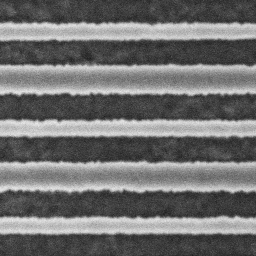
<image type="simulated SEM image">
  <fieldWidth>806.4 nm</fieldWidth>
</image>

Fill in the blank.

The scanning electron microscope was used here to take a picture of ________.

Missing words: lines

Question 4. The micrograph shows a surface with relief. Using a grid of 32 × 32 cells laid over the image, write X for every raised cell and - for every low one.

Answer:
--------------------------------
--------------------------------
--------------------------------
XXXXXXXXXXXXXXXXXXXXXXXXXXXXXXXX
XXXXXXXXXXXXXXXXXXXXXXXXXXXXXXXX
--------------------------------
--------------------------------
--------------------------------
XXXXXXXXXXXXXXXXXXXXXXXXXXXXXXXX
XXXXXXXXXXXXXXXXXXXXXXXXXXXXXXXX
XXXXXXXXXXXXXXXXXXXXXXXXXXXXXXXX
XXXXXXXXXXXXXXXXXXXXXXXXXXXXXXXX
--------------------------------
--------------------------------
--------------------------------
XXXXXXXXXXXXXXXXXXXXXXXXXXXXXXXX
XXXXXXXXXXXXXXXXXXXXXXXXXXXXXXXX
--------------------------------
--------------------------------
--------------------------------
XXXXXXXXXXXXXXXXXXXXXXXXXXXXXXXX
XXXXXXXXXXXXXXXXXXXXXXXXXXXXXXXX
XXXXXXXXXXXXXXXXXXXXXXXXXXXXXXXX
XXXXXXXXXXXXXXXXXXXXXXXXXXXXXXXX
--------------------------------
--------------------------------
--------------------------------
XXXXXXXXXXXXXXXXXXXXXXXXXXXXXXXX
XXXXXXXXXXXXXXXXXXXXXXXXXXXXXXXX
--------------------------------
--------------------------------
--------------------------------